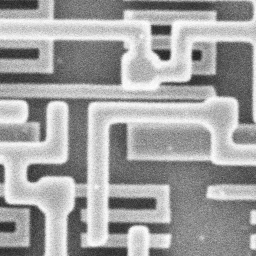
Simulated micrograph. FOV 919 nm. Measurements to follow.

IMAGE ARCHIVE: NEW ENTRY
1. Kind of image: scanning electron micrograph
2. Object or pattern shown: wiring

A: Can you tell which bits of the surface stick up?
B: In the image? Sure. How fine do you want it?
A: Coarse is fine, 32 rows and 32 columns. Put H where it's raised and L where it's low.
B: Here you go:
LLLLLLLLLLLLLLLLLLLLLLLLLLLLLLLL
LLLLLLLLLLLLLLLLLLLLLLLLLLLLLLLL
HLLLLLLLLLLLLLLLLLLLLLLLLLLLLLLH
HHHHHHHHHHHHHHHHHHHLLLHHHHHHHHHH
HHHHHHHHHHHHHHHHHHHLLHHHHHHHHHHH
LLLLLLLLLLLLLLLLHHHLLHHHLLLLLLLL
LLLLLLLLLLLLLLLLHHHLLHHHLLLLLLLL
LLLLLLLLLLLLLLLHHHHHLHHHLLLLLLLL
LLLLLLLLLLLLLLLHHHHHHHHHLLLLLLLL
LLLLLLLLLLLLLLLHHHHHHHHHLLLLLLLL
LLLLLLLLLLLLLLLHHHHHLLLLLLLLLLLL
LLLLLLLLLLLLLLLLLLLLLLLLLLLLLLLL
LLLLLLLLLLLLLLLLLLLLLLLLLLHHHLLL
HHHLLLHHLLLHHHHHHHHHHHHHHHHHHHLL
HHHLLLHHLLLHHHHHHHHHHHHHHHHHHHLL
LLLLLLHHLLLHHHLLLLLLLLLLLHHHHHLL
LLLLLLHHLLLHHLLLLLLLLLLLLLHHHLLL
LLLLLLHHLLLHHLLLLLLLLLLLLLHHHLLL
HHHHHHHHLLLHHLLLLLLLLLLLLLHHHHHH
HHHHHHHHLLLHHLLLLLLLLLLLLLLHHHHH
HHHHLLLLLLLHHLLLLLLLLLLLLLLLHHHH
LHHLLLLLLLLHHLLLLLLLLLLLLLLLLLLL
LHHLLHHHHLLHHLLLLLLLLLLLLLLLLLLL
LHHHHHHHHLLHHLLLLLLLLLLLLLLLLLLL
LHHHHHHHHLLHHLLLLLLLLLLLLLLLLLLL
LLLLHHHHHLLHHLLLLLLLLLLLLLLLLLLL
LLLLLHHHHLLHHLLLLLLLLLLLLLLLLLLL
LLLLLLHHLLLHHLLLLLLLLLLLLLLLLLLL
LLLLLLHHLLLHHLLLHHLLLLLLLLLLLLLL
LLLLLLHHLLLHHLLLHHLLLLLLLLLLLLLL
LLLLLLHHLLLHHLLLHHLLLLLLLLLLLLLL
LLLLLLHHLLLLLLLLHHLLLLLLLLLLLLLL